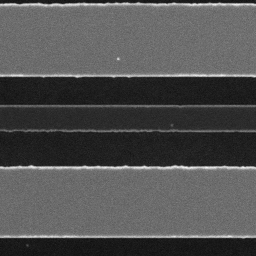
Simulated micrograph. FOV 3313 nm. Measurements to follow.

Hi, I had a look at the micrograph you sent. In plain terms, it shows lines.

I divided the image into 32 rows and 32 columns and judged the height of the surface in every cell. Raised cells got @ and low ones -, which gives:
@@@@@@@@@@@@@@@@@@@@@@@@@@@@@@@@
@@@@@@@@@@@@@@@@@@@@@@@@@@@@@@@@
@@@@@@@@@@@@@@@@@@@@@@@@@@@@@@@@
@@@@@@@@@@@@@@@@@@@@@@@@@@@@@@@@
@@@@@@@@@@@@@@@@@@@@@@@@@@@@@@@@
@@@@@@@@@@@@@@@@@@@@@@@@@@@@@@@@
@@@@@@@@@@@@@@@@@@@@@@@@@@@@@@@@
@@@@@@@@@@@@@@@@@@@@@@@@@@@@@@@@
@@@@@@@@@@@@@@@@@@@@@@@@@@@@@@@@
@@@@@@@@@@@@@@@@@@@@@@@@@@@@@@@@
--------------------------------
--------------------------------
--------------------------------
@@@@@@@@@@@@@@@@@@@@@@@@@@@@@@@@
@@@@@@@@@@@@@@@@@@@@@@@@@@@@@@@@
@@@@@@@@@@@@@@@@@@@@@@@@@@@@@@@@
--------------------------------
--------------------------------
--------------------------------
--------------------------------
--------------------------------
@@@@@@@@@@@@@@@@@@@@@@@@@@@@@@@@
@@@@@@@@@@@@@@@@@@@@@@@@@@@@@@@@
@@@@@@@@@@@@@@@@@@@@@@@@@@@@@@@@
@@@@@@@@@@@@@@@@@@@@@@@@@@@@@@@@
@@@@@@@@@@@@@@@@@@@@@@@@@@@@@@@@
@@@@@@@@@@@@@@@@@@@@@@@@@@@@@@@@
@@@@@@@@@@@@@@@@@@@@@@@@@@@@@@@@
@@@@@@@@@@@@@@@@@@@@@@@@@@@@@@@@
@@@@@@@@@@@@@@@@@@@@@@@@@@@@@@@@
--------------------------------
--------------------------------